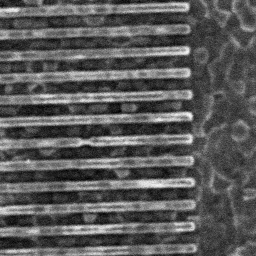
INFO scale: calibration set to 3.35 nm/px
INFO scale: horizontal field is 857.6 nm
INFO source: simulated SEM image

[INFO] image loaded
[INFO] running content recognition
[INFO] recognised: parallel lines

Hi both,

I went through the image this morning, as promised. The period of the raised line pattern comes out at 21.9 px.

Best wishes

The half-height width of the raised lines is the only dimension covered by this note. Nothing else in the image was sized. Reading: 25.9 nm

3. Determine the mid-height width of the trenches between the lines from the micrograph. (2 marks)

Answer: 13.6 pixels